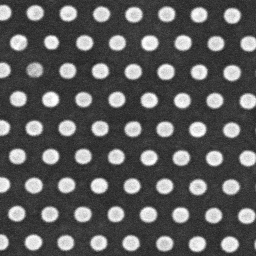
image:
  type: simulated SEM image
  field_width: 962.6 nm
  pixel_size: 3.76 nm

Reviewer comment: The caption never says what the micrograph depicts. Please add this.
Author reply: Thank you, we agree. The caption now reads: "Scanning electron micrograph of a regular array of raised bodies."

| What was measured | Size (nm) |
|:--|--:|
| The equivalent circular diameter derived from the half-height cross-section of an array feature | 54.7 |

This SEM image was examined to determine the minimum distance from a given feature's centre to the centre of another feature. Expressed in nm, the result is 122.